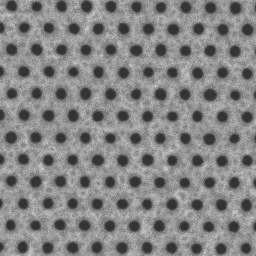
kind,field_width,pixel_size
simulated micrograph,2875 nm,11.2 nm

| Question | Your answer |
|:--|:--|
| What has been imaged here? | a regular array of holes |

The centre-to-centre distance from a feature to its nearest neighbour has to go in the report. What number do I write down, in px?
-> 24.4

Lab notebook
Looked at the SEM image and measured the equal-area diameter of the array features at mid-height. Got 122 nanometres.